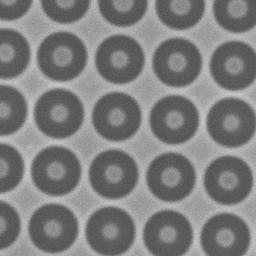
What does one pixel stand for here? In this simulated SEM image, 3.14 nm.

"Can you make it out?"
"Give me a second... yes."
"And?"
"an array of small figures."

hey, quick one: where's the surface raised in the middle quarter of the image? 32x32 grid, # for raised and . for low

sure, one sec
......##.....##.....##....####..
.....###............##.....##...
....#####..........####.........
...#######........#####.........
.##########......#######........
##########################.....#
.###############################
...#######......###########.####
....#####........#######.......#
.....###..........#####.........
.....##............###..........
#....##.....##.....###..........
#....##.....###.....#.....###...
.....##....####....##.....####..
.....##.....###....##.....####..
....###............##.....###...
....####...........###..........
...######.........####..........
.#########.......######.........
#############.##########.......#
################################
..#########...##################
...#####........########.....###
....####.........######........#
....###...........####..........
....##............###...........
.....#.....###.....##....###....
.....#....####.....##....####...
....##.....###.....#.....####...
....##......#.....###....####...
...####...........###.....#.....
...####..........####...........